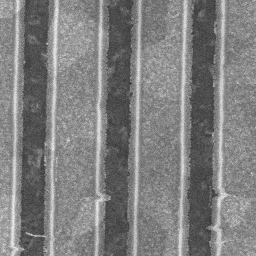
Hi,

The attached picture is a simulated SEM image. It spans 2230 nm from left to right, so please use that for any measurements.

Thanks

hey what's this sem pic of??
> one or a few lines or trenches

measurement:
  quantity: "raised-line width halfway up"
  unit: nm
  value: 393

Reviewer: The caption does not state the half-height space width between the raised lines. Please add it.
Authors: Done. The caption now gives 334 nm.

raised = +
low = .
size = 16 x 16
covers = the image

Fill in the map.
+...++...+++..++
+..+++...+++..++
+..+++...+++..++
+..+++...++...++
+..+++...++...++
+..+++...++...++
+..+++...++...++
+..+++...++...++
+..+++...++...++
+..+++...++...++
+..+++...++...++
+..+++...++...++
+..+++...++...++
+..+++..+++...++
+..+++..+++...++
+..+++..+++...++